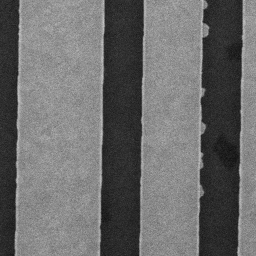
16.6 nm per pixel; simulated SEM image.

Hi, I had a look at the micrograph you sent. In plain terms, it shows lines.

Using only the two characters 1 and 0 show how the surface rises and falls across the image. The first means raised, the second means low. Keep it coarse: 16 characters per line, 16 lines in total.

0111110001111001
0111110001111001
0111110001111001
0111110001111001
0111110001111001
0111110001111001
0111110001111001
0111110001111001
0111110001110001
0111110001110001
0111110001110001
0111110001110001
0111110001110001
0111110001110001
0111110001110001
0111110001110001